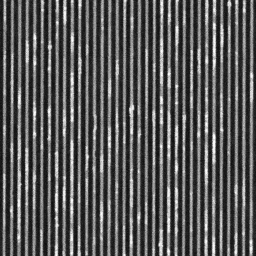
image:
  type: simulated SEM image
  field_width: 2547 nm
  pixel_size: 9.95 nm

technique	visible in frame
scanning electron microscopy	parallel lines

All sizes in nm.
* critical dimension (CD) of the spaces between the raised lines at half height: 51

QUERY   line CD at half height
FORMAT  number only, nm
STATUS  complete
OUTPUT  24.9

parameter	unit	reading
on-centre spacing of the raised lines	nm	74.4